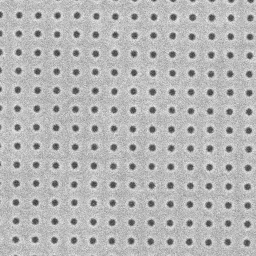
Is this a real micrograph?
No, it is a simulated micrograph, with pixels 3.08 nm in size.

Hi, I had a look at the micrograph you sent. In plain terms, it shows a regular array of holes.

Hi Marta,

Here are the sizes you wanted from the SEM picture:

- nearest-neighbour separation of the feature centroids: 57.1 nm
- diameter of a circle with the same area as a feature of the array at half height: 22.3 nm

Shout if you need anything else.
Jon